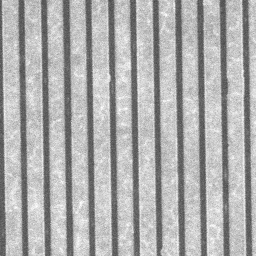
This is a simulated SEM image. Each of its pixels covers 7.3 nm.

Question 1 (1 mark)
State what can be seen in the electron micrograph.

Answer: parallel lines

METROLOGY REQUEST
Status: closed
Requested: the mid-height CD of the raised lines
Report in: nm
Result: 110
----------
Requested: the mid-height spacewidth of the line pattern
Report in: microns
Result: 0.0483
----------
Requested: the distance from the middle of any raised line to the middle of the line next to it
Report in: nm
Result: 163